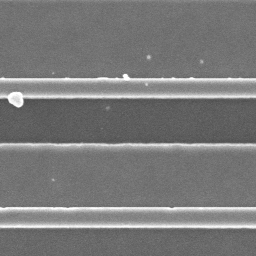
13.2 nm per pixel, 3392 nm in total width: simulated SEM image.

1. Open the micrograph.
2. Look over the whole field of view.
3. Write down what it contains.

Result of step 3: lines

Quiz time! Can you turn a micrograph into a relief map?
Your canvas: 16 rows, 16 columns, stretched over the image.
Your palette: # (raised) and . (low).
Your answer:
################
################
################
################
################
################
................
................
................
################
################
################
################
################
................
................